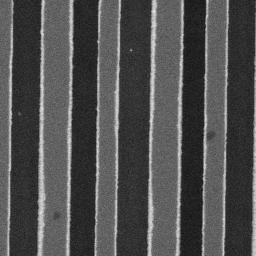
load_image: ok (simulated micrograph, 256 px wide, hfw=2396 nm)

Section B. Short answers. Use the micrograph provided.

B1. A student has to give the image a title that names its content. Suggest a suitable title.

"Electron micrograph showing lines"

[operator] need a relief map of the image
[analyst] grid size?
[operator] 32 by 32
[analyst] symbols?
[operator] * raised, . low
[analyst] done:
**...****...***....****...***...
**...****...***....****...***...
**...****...***....****...***...
**...****...***....****...**....
**...****...***....****...**....
**...****...***....****...**....
**...****...***....****...**....
**...****...***....****...**....
*....****...***....****...**....
*....****...***....****...**....
*....****...***....****...**....
*....****...***....****...**....
*....****...***....****...**....
*....****...***....****...**....
*....****...***....****...**....
*....****...***....****...**....
*....****...***....****...**....
*....****...***....****...**....
*....****...***....****...**....
*....****...***....****...**....
*....****...***....****...**....
*....****...***....****..***....
*....****...***....****..***....
*....****...***....***...***....
*....****...***....***...***....
*....****...***....***...***....
*....****...***....***...***....
*....****...***....***...***....
*....****...***....***...***....
*....****...***....***...***....
*....****...**.....***...***....
*....****...**.....***...***....